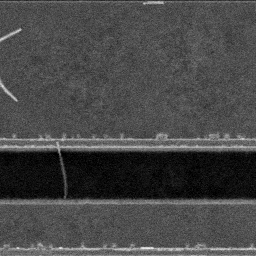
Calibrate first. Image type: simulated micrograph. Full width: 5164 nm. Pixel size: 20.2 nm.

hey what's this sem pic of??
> lines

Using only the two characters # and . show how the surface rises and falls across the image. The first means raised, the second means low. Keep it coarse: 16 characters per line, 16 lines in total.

################
################
################
################
################
################
################
################
################
................
................
................
................
################
################
################